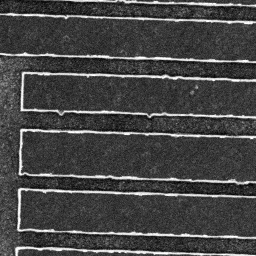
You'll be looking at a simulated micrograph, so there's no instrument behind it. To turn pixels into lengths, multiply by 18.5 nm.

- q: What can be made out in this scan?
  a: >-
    parallel lines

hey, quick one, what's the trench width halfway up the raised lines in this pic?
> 0.312 um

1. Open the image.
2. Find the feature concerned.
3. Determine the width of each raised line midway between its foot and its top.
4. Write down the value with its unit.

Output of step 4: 756 nanometers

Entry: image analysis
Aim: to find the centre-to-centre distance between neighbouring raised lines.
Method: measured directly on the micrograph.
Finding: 1.08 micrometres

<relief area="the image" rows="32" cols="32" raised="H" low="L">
LLLLLLLLLLLLLLLLLLLLLLLLHHHHHHHH
LLLLLLLLLLLLLLLLLLLLLLLLLLLLLLLL
HHHHHHHHHHHHHHHHHHHHHLLHHLLLLLLL
HHHHHHHHHHHHHHHHHHHHHHHHHHHHHHHH
HHHHHHHHHHHHHHHHHHHHHHHHHHHHHHHH
HHHHHHHHHHHHHHHHHHHHHHHHHHHHHHHH
HHHHHHHHHHHHHHHHHHHHHHHHHHHHHHHH
LLLLLLLLLLLLLLLLLLLLLLLLHHHHHHHH
LLLLLLLLLLLLLLLLLLLLLLLLLLLLLLLL
LLLHHHHHHHHHHHLLLLLLLLLLLLLLLLLL
LLLHHHHHHHHHHHHHHHHHHHHHHHHHHHHH
LLLHHHHHHHHHHHHHHHHHHHHHHHHHHHHH
LLLHHHHHHHHHHHHHHHHHHHHHHHHHHHHH
LLLHHHHHHHHHHHHHHHHHHHHHHHHHHHHH
LLLLLLLLLLLLLLLLLLLLLLLLLLHLHHHH
LLLLLLLLLLLLLLLLLLLLLLLLLLLLLLLL
LLLHHHHHHHHLLLLLLLLLLLLLLLLLLLLL
LLLHHHHHHHHHHHHHHHHHHHHHHHHHHHHH
LLLHHHHHHHHHHHHHHHHHHHHHHHHHHHHH
LLLHHHHHHHHHHHHHHHHHHHHHHHHHHHHH
LLLHHHHHHHHHHHHHHHHHHHHHHHHHHHHH
LLLHHHHHHHHHHHHHHHHHHHHHHHHHHHHH
LLLLLLLLLLLLLLLLLLLLLLLHHHHHHHHH
LLLLLLLLLLLLLLLLLLLLLLLLLLLLLLLL
LLHHHHHHHHHHHHHHHHHHHHHHHHHHLLLL
LLLHHHHHHHHHHHHHHHHHHHHHHHHHHHHH
LLHHHHHHHHHHHHHHHHHHHHHHHHHHHHHH
LLHHHHHHHHHHHHHHHHHHHHHHHHHHHHHH
LLHHHHHHHHHHHHHHHHHHHHHHHHHHHHHH
LLLLLLLLLLLLLLLLLLLLLLLLHHHHHHHH
LLLLLLLLLLLLLLLLLLLLLLLLLLLLLLLL
LLHHHHHHHHHHHHHHHLLLLLLLLLLLLLLL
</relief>